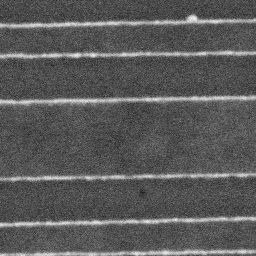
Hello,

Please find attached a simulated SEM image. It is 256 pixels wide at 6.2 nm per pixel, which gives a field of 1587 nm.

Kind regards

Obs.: lines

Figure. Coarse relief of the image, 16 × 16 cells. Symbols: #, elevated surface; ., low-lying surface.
................
....############
################
.##.............
................
................
################
################
################
################
################
................
................
................
################
################